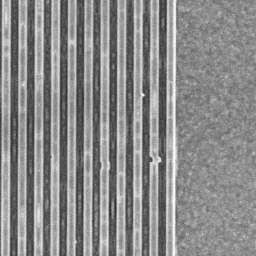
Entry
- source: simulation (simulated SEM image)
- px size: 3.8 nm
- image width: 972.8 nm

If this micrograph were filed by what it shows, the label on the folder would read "parallel lines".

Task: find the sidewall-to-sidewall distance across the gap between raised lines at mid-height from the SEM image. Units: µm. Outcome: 0.034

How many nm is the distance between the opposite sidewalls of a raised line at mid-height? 30.9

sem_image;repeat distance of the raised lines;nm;62.6